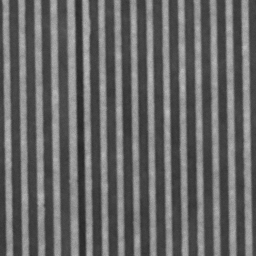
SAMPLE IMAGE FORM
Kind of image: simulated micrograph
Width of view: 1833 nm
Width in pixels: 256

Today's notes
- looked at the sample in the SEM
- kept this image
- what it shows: parallel lines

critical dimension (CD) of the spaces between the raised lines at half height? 66.3 nm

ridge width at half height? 48.4 nanometres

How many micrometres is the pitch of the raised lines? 0.114